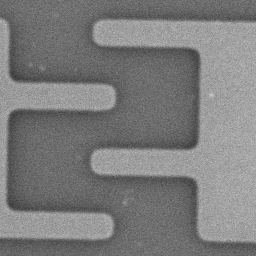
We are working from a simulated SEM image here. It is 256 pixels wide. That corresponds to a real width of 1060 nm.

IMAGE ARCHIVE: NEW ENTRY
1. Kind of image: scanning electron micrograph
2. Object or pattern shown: groups of lines, slits or small figures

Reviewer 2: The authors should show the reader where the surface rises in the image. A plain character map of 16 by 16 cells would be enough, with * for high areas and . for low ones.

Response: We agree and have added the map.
................
......**********
......**********
............****
*............***
*******......***
*******......***
.............***
............****
......**********
......**********
............****
............****
*******.....****
*******.....****
................